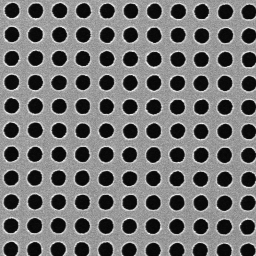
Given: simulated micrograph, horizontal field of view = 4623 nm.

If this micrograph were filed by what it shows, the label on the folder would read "a regular array of holes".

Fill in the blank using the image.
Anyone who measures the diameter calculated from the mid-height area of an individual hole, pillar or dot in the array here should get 275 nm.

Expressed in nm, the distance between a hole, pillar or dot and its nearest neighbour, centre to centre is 424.